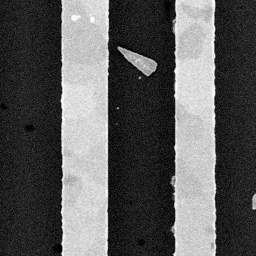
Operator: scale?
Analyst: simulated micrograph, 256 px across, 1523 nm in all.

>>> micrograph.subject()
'lines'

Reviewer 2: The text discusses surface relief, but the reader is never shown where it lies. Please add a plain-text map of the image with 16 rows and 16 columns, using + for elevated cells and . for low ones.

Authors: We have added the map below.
....+++....++...
....+++....++...
....+++....++...
....+++....++...
....+++....++...
....+++....++...
....+++....++...
....+++....++...
....+++....++...
....+++....++...
....+++....++...
....+++....++...
....+++....++...
....+++....++...
....+++....++...
....+++....++...